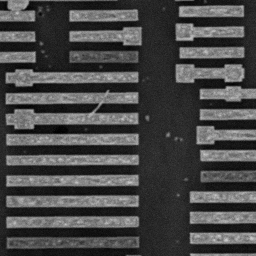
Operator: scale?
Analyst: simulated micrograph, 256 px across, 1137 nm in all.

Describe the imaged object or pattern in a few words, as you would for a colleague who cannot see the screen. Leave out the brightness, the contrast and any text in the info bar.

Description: wiring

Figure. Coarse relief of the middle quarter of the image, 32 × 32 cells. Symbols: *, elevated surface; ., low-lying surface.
............................****
............................****
******************..........****
******************..........****
*****...........................
................................
................................
******************..............
******************..............
******************..............
................................
................................
******************..............
******************..............
******************..............
................................
................................
................................
******************..............
******************..............
................................
................................
................................
******************..............
******************..............
................................
................................
................................
******************..............
********.*********..............
................................
................................